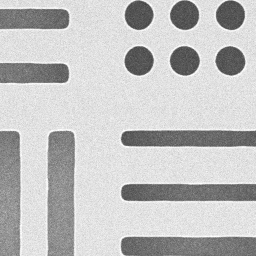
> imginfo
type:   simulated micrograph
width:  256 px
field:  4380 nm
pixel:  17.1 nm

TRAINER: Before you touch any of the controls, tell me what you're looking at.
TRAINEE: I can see groups of lines, slits or small figures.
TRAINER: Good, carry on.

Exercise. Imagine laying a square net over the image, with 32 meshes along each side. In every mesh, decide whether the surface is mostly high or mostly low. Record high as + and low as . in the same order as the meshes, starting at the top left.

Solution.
++++++++++++++++...+++..++++..++
.........+++++++...++....++....+
.........+++++++...++....++....+
........++++++++..++++..++++..++
++++++++++++++++++++++++++++++++
++++++++++++++++++++++++++++++++
++++++++++++++++...+++...++...++
++++++++++++++++...++....++....+
.........+++++++...++....++...++
.........+++++++++++++++++++++++
++++++++++++++++++++++++++++++++
++++++++++++++++++++++++++++++++
++++++++++++++++++++++++++++++++
++++++++++++++++++++++++++++++++
++++++++++++++++++++++++++++++++
++++++++++++++++++++++++++++++++
..+++++..+++++++................
...+++...++++++.................
...+++...+++++++++++++++++++++++
...+++...+++++++++++++++++++++++
...+++...+++++++++++++++++++++++
...+++...+++++++++++++++++++++++
...+++...+++++++++++++++++++++++
...+++...++++++.................
...+++...++++++.................
...+++...+++++++++++++++++++++++
...+++...+++++++++++++++++++++++
...+++...+++++++++++++++++++++++
...+++...+++++++++++++++++++++++
...+++...+++++++......++++++..++
...+++...++++++.................
...+++...++++++.................